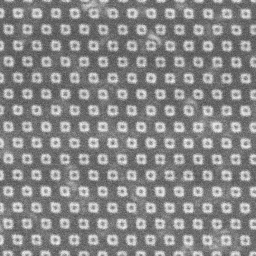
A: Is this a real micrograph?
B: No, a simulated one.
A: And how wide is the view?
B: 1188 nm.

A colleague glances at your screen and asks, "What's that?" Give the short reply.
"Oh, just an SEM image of a regular array of raised bodies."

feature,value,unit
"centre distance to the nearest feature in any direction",85.6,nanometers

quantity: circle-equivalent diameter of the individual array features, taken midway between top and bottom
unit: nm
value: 41.9